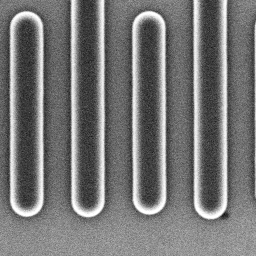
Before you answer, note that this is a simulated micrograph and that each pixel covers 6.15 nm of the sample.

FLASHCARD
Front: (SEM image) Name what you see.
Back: groups of lines, slits or small figures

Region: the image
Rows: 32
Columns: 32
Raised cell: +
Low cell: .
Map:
.........++++...........++++....
.........++++...........++++....
..+++....++++....+++....++++....
.++++....++++....++++...++++....
.++++....++++....++++...++++....
.++++....++++....++++...++++....
.++++....++++....++++...++++....
.++++....++++....++++...++++....
.++++....++++....++++...++++....
.++++....++++....++++...++++....
.++++....++++....++++...++++....
.++++....++++....++++...++++....
.++++....++++....++++...++++....
.++++....++++....++++...++++....
.++++....++++....++++...++++....
.++++....++++....++++...++++....
.++++....++++....++++...++++....
.++++....++++....++++...++++....
.++++....++++....++++...++++....
.++++....++++....++++...++++....
.++++....++++....++++...++++....
.++++....++++....++++...++++....
.++++....++++....++++...++++....
.++++....++++....++++...++++....
.++++....++++....++++...++++....
.++++....++++....++++...++++....
..+++.....++......++.....+++....
................................
................................
................................
................................
................................